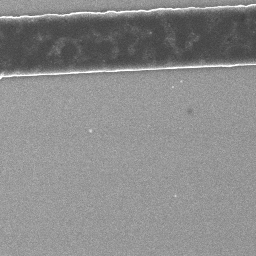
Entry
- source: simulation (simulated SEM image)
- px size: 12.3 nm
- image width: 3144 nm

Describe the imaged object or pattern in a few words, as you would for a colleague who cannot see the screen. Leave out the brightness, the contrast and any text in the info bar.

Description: one or a few lines or trenches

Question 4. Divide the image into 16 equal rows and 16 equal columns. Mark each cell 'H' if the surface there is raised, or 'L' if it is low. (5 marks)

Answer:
LLLLLLLLLLLLHHHH
HHHHHHHHHHHHHHHH
HHHHHHHHHHHHHHHH
HHHHHHHHHHHHHHHH
HHHHHHLLLLLLLLLL
LLLLLLLLLLLLLLLL
LLLLLLLLLLLLLLLL
LLLLLLLLLLLLLLLL
LLLLLLLLLLLLLLLL
LLLLLLLLLLLLLLLL
LLLLLLLLLLLLLLLL
LLLLLLLLLLLLLLLL
LLLLLLLLLLLLLLLL
LLLLLLLLLLLLLLLL
LLLLLLLLLLLLLLLL
LLLLLLLLLLLLLLLL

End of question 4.